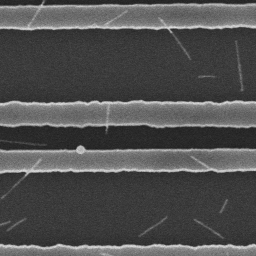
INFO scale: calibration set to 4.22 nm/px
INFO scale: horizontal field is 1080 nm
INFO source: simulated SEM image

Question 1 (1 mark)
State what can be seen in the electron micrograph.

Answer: lines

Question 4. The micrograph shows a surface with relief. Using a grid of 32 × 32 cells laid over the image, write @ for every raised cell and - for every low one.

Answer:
--------------------------@@----
@@@@@@@@@@@@@@@@@@@@@@@@@@@@@@@@
@@@@@@@@@@@@@@@@@@@@@@@@@@@@@@@@
--@@@@@@-@@---@-@@-@@@----@-----
--------------------------------
--------------------------------
--------------------------------
--------------------------------
--------------------------------
--------------------------------
--------------------------------
--------------------------------
--------------------------------
@@@@@@@@@@@@@@@@@@@@@@@@@@@@@@@@
@@@@@@@@@@@@@@@@@@@@@@@@@@@@@@@@
@@@@@@@@@@@@@@@@@@@@@@@@@@@@@@@@
--------------------------------
--------------------------------
--------------------------------
@@@@@@@@@@@@@@@@@@@@@@@@@@@@@@@@
@@@@@@@@@@@@@@@@@@@@@@@@@@@@@@@@
@@@@@-------------------@--@----
--------------------------------
--------------------------------
--------------------------------
--------------------------------
--------------------------------
--------------------------------
--------------------------------
--------------------------------
--------------------------------
@@@@@@@@@@@@@@@@@@@@@@@@@@@@@@@@